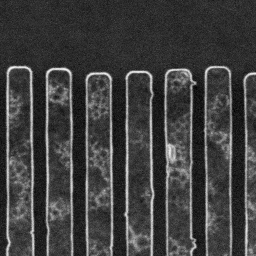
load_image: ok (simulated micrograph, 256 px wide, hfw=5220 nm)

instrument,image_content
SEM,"parallel lines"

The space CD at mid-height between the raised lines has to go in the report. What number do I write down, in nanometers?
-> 308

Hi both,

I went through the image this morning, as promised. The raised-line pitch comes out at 810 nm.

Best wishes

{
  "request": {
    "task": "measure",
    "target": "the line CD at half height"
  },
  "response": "507 nm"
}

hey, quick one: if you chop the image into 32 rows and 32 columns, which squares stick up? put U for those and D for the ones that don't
DDDDDDDDDDDDDDDDDDDDDDDDDDDDDDDD
DDDDDDDDDDDDDDDDDDDDDDDDDDDDDDDD
DDDDDDDDDDDDDDDDDDDDDDDDDDDDDDDD
DDDDDDDDDDDDDDDDDDDDDDDDDDDDDDDD
DDDDDDDDDDDDDDDDDDDDDDDDDDDDDDDD
DDDDDDDDDDDDDDDDDDDDDDDDDDDDDDDD
DDDDDDDDDDDDDDDDDDDDDDDDDDDDDDDD
DDDDDDDDDDDDDDDDDDDDDDDDDDDDDDDD
DDUDDDDDDDDDDDDDDDDDDDDDDDUUDDDD
DUUUDDUUUDDUUUDDUUUDDUUUDDUUUDDU
DUUUDDUUUDDUUUDDUUUDDUUUDDUUUDDU
DUUUDDUUUDDUUUDDUUUDDUUUDDUUUDDU
DUUUDDUUUDDUUUDDUUUDDUUUDDUUUDDU
DUUUDDUUUDDUUUDDUUUDDUUUDDUUUDDU
DUUUDDUUUDDUUUDDUUUDDUUUDDUUUDDU
DUUUDDUUUDDUUUDDUUUDDUUUDDUUUDDU
DUUUDDUUUDDUUUDDUUUDDUUUDDUUUDDU
DUUUDDUUUDDUUUDDUUUDDUUUDDUUUDDU
DUUUDDUUUDDUUUDDUUUDDUUUDDUUUDDU
DUUUDDUUUDDUUUDDUUUDDUUUDDUUUDDU
DUUUDDUUUDDUUUDDUUUDDUUUDDUUUDDU
DUUUDDUUUDDUUUDDUUUDDUUUDDUUUDDU
DUUUDDUUUDDUUUDDUUUDDUUUDDUUUDDU
DUUUDDUUUDDUUUDDUUUDDUUUDDUUUDDU
DUUUDDUUUDDUUUDDUUUDDUUUDDUUUDDU
DUUUDDUUUDDUUUDDUUUDDUUUDDUUUDDU
DUUUDDUUUDDUUUDDUUUDDUUUDDUUUDDU
DUUUDDUUUDDUUUDDUUUDDUUUDDUUUDDU
DUUUDDUUUDDUUUDDUUUDDUUUDDUUUDDU
DUUUDDUUUDDUUUDDUUUDDUUUDDUUUDDU
DUUUDDUUUDDUUUDDUUUDDUUUDDUUUDDU
DUUUDDUUUDDUUUDDUUUDDUUUDDUUUDDU